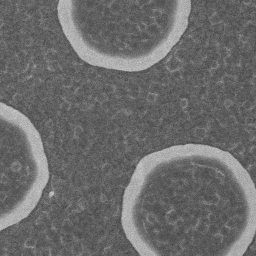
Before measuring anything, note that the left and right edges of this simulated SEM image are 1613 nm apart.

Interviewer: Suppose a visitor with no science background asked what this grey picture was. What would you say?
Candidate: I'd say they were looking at raised bodies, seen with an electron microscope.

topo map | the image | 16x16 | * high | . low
....*******.....
....*******.....
.....******.....
......****......
................
................
................
*...............
**..............
**.........**...
***......******.
**.......******.
**......********
*.......********
........********
.........******.